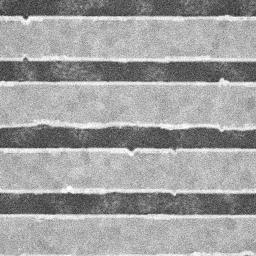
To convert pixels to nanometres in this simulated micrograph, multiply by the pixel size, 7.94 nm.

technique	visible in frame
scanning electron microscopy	one or a few lines or trenches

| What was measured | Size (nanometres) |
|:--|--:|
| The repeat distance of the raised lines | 524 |